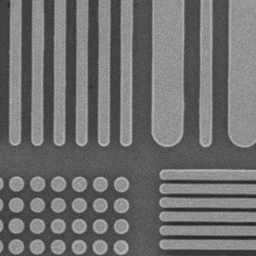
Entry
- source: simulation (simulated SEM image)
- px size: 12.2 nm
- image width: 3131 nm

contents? groups of lines, slits or small figures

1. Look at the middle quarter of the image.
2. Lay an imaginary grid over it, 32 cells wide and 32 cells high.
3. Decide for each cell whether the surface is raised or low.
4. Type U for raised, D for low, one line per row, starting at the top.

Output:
DDDUUUDDDUUDDDUUUDDDDDUUUUUUUUDD
DDDUUUDDDUUDDDUUUDDDDDUUUUUUUUDD
DDDUUUDDDUUDDDUUUDDDDDUUUUUUUUDD
DDDUUUDDDUUDDDUUUDDDDDUUUUUUUUDD
DDDUUUDDDUUDDDUUUDDDDDUUUUUUUUDD
DDDUUUDDDUUDDDUUUDDDDDUUUUUUUUDD
DDDUUUDDDUUDDDUUUDDDDDUUUUUUUUDD
DDDUUUDDDUUDDDUUUDDDDDUUUUUUUUDD
DDDUUUDDDUUDDDUUUDDDDDUUUUUUUUDD
DDDUUUDDDUUDDDUUUDDDDDUUUUUUUUDD
DDDUUUDDDUUDDDUUUDDDDDUUUUUUUUDD
DDDUUUDDDUUDDDUUUDDDDDUUUUUUUUDD
DDDUUUDDDUUDDDUUUDDDDDUUUUUUUUDD
DDDUUUDDDUUDDDUUUDDDDDUUUUUUUUDD
DDDUUUDDDUUDDDUUUDDDDDUUUUUUUUDD
DDDUUDDDDUUDDDUUUDDDDDUUUUUUUUDD
DDDUUDDDDUUDDDUUUDDDDDUUUUUUUDDD
DDDUUDDDDUUDDDUUUDDDDDUUUUUUUDDD
DDDUUDDDDUUDDDUUUDDDDDDUUUUUUDDD
DDDUUDDDDUUDDDUUUDDDDDDUUUUUDDDD
DDDDDDDDDDDDDDDDDDDDDDDDDDDDDDDD
DDDDDDDDDDDDDDDDDDDDDDDDDDDDDDDD
DDDDDDDDDDDDDDDDDDDDDDDDDDDDDDDD
DDDDDDDDDDDDDDDDDDDDDDDDDDDDDDDD
DDDDDDDDDDDDDDDDDDDDDDDDDDDDDDDD
DDDDDDDDDDDDDDDDDDDDDDDDDDDDDDDD
DDDDDDDDDDDDDDDDDDDDDDDDDDDDDDDD
DDDDDDDDDDDDDDDDDDDDDDDDUUUUUUUU
DDDUUDDDDDDDDDDDDDDDDDDDUUUUUUUU
DDUUUDDUUUUDDUUUDDDDDDDDDDDDDDDD
DDUUUDDUUUUDDUUUDDDDDDDDUUUUUUUU
DDDUUDDDUUDDDUUDDDDDDDDDUUUUUUUU